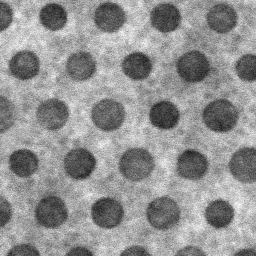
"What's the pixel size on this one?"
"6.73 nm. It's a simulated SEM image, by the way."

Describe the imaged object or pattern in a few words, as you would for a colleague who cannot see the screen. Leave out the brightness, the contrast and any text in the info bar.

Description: a regular array of holes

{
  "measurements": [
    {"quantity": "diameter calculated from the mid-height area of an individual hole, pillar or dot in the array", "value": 31.6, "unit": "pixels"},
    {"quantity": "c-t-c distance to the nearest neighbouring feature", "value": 376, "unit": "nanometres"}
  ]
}